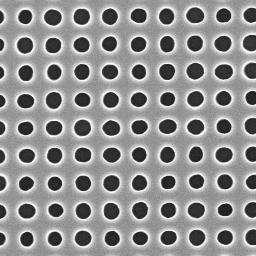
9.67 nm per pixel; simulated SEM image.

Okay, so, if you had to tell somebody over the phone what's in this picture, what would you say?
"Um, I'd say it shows a regular array of holes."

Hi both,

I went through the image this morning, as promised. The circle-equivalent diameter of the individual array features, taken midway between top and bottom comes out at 0.155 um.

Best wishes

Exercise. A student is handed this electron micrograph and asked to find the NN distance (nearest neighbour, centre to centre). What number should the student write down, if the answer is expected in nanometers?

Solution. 266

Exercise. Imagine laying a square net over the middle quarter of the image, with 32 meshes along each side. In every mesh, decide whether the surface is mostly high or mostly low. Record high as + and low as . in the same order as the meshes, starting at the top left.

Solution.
+++...++++...+++++..++++...++++.
+++....+++....+++....+++....+++.
+++...++++....+++....+++....+++.
+++...++++...+++++..++++...+++++
++++++++++++++++++++++++++++++++
++++++++++++++++++++++++++++++++
++++++++++++++++++++++++++++++++
+++...++++...++++...+++++..++++.
+++....+++....+++....+++....+++.
+++....+++....+++....+++....+++.
++++..++++...++++...+++++.++++++
++++++++++++++++++++++++++++++++
++++++++++++++++++++++++++++++++
++++++++++++++++++++++++++++++++
+++...+++++..++++...++++....+++.
++.....+++....+++....+++....+++.
++.....+++....+++....+++....+++.
+++...++++...+++++..++++++++++++
++++++++++++++++++++++++++++++++
++++++++++++++++++++++++++++++++
++++++++++++++++++++++++++++++++
+++...++++....+++...++++...+++++
+++....+++....+++....+++....+++.
+++....+++....+++...++++....+++.
++++..+++++..+++++..+++++.++++++
++++++++++++++++++++++++++++++++
++++++++++++++++++++++++++++++++
++++++++++++++++++++++++++++++++
+++...++++....++++..+++++...+++.
+++....+++....+++....+++....+++.
+++....+++....+++....+++....++++
++++..+++++..+++++..+++++.++++++